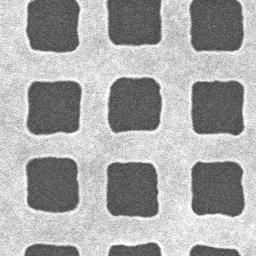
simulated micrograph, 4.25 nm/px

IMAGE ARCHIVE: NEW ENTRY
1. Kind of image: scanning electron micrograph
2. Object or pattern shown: holes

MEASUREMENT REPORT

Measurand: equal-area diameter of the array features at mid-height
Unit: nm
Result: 250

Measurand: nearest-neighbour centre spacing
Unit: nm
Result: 341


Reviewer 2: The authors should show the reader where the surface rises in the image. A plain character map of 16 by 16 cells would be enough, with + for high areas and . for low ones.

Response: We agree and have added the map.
++...++...++...+
++...++...++...+
++...++...++...+
++++++++++++++++
++++++++++++++++
++...++...++...+
++...++...++...+
++...++...++...+
++++++++++++++++
++++++++++++++++
++...++...++...+
++...++...++...+
++...++...++...+
++++++++..++++.+
++++++++++++++++
++...++...++..++